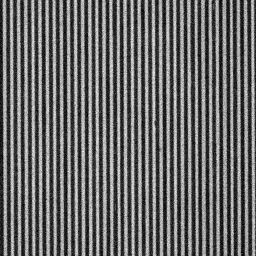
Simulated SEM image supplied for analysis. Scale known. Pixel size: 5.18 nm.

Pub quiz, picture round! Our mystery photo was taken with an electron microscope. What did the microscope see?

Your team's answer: parallel lines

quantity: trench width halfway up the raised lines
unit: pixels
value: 3.75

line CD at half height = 14.3 nanometers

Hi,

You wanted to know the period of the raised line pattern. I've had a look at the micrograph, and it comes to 36.8 nm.